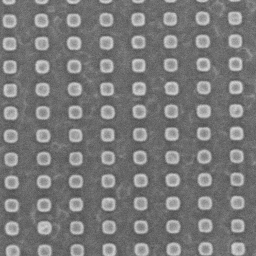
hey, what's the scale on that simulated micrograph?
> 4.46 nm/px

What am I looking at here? a regular array of raised bodies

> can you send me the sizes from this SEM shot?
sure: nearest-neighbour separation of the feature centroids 102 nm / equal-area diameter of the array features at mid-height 60.9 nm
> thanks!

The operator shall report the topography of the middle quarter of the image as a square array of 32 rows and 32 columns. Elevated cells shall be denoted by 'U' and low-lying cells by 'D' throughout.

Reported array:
DUUUDDDDDUUUDDDDDUUUDDDDDUUUDDDD
DUUUDDDDDUUUDDDDDUUUDDDDDDUUDDDD
DDDDDDDDDDDDDDDDDDDDDDDDDDDDDDDD
DDDDDDDDDDDDDDDDDDDDDDDDDDDDDDDD
DDDDDDDDDDDDDDDDDDDDDDDDDDDDDDDD
DUUUDDDDDUUUDDDDDUUUDDDDDUUUDDDD
DUUUDDDDDUUUDDDDDUUUDDDDDUUUDDDD
DDUUDDDDDDUUDDDDDDUUDDDDDDUUDDDD
DDDDDDDDDDDDDDDDDDDDDDDDDDDDDDDD
DDDDDDDDDDDDDDDDDDDDDDDDDDDDDDDD
DDDDDDDDDDDDDDDDDDDDDDDDDDUUDDDD
DUUUDDDDDUUUDDDDDUUUDDDDDUUUDDDD
DUUUDDDDDDUUDDDDDUUUDDDDDUUUDDDD
DDUUDDDDDDDDDDDDDDDDDDDDDDDDDDDD
DDDDDDDDDDDDDDDDDDDDDDDDDDDDDDDD
DDDDDDDDDDDDDDDDDDDDDDDDDDDDDDDD
DDUUDDDDDDUUDDDDDDUUDDDDDDUUDDDD
DUUUDDDDDUUUDDDDDUUUDDDDDUUUDDDD
DUUUDDDDDUUUDDDDDUUUDDDDDDUUDDDD
DDDDDDDDDDDDDDDDDDDDDDDDDDDDDDDD
DDDDDDDDDDDDDDDDDDDDDDDDDDDDDDDD
DDDDDDDDDDDDDDDDDDDDDDDDDDDDDDDD
DUUUDDDDDUUUDDDDDUUUDDDDDDUUDDDD
DUUUDDDDDUUUDDDDDUUUDDDDDDUUDDDD
DDUUUDDDDDUUDDDDDDUUUDDDDDUUDDDD
DDDDDDDDDDDDDDDDDDDDDDDDDDDDDDDD
DDDDDDDDDDDDDDDDDDDDDDDDDDDDDDDD
DDDDDDDDDDDDDDDDDDDDDDDDDDDDDDDD
DDUUDDDDDDUUUDDDDDUUUDDDDDUUUDDD
DDUUUDDDDDUUUDDDDDUUUDDDDDUUUDDD
DDUUDDDDDDUUDDDDDDUUDDDDDDUUDDDD
DDDDDDDDDDDDDDDDDDDDDDDDDDDDDDDD